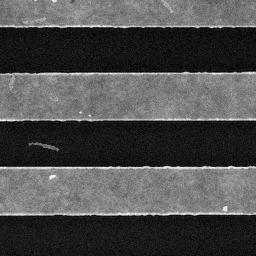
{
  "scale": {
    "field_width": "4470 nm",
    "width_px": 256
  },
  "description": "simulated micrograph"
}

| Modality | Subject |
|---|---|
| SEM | lines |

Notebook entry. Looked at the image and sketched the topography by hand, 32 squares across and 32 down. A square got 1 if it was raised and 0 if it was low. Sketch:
11111111111111111111111111111111
11111111111111111111111111111111
11111111111111111111111111111111
00000000000000000000000000000000
00000000000000000000000000000000
00000000000000000000000000000000
00000000000000000000000000000000
00000000000000000000000000000000
00000000000000000000000000000000
11111111111111111111111111111111
11111111111111111111111111111111
11111111111111111111111111111111
11111111111111111111111111111111
11111111111111111111111111111111
11111111111111111111111111111111
00000000000000000000000000000000
00000000000000000000000000000000
00000000000000000000000000000000
00000000000000000000000000000000
00000000000000000000000000000000
00000000000000000000000000000000
11111111111111111111111111111111
11111111111111111111111111111111
11111111111111111111111111111111
11111111111111111111111111111111
11111111111111111111111111111111
11111111111111111111111111111111
00000000000000000000000000000000
00000000000000000000000000000000
00000000000000000000000000000000
00000000000000000000000000000000
00000000000000000000000000000000